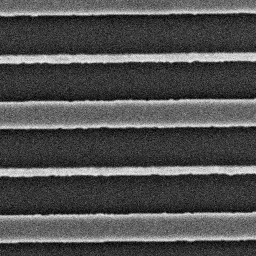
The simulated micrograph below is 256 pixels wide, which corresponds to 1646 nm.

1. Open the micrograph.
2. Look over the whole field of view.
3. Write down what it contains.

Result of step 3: lines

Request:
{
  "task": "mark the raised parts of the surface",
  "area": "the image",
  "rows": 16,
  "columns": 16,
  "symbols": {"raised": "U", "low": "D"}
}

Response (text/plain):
UUUUUUUUUUUUUUUU
DDDDDDDDDDDDDDDD
DDDDDDDDDDDDDDDD
DDDDDDDDDDDUDUDD
DDDDDDDDDDDDDDDD
DDDDDDDDDDDDDDDD
UUUUUUUUUUUUUUUU
UUUUUUUUUUUUUUUU
DDDDDDDDDDDDDDDD
DDDDDDDDDDDDDDDD
DDDDDDDDDDDDDDUD
DDDDDDDDDDDDDDDD
DDDDDDDDDDDDDDDD
UUUUUUUUUUUUUUUU
UUUUUUUUUUUUUUUU
DDDDDDDDDDDDDDDD